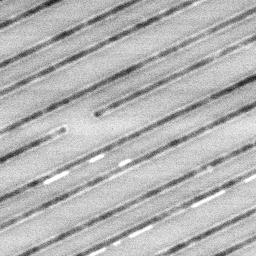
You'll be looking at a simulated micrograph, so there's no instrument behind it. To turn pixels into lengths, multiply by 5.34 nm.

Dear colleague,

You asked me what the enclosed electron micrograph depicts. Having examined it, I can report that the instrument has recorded parallel lines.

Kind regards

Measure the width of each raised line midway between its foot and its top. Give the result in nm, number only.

42.2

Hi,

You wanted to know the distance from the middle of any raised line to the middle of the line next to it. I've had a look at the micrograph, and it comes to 30 pixels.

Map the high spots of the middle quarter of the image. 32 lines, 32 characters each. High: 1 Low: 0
10000000000000001111100000000001
00000000000000111110000000000111
00000000000011111000000000011110
00000000001111100000000001111000
00000000111110000000000111100000
00000011111000000000011110000000
00001111100000000011111000000000
00111110000000001111100000000000
11111000000000111110000000000000
11000000000011110000000000000000
00000000001111000000000000000001
00000000111100000000000000000111
00000001110000000000000000011110
00000000000000000000000011111000
00000000000000000000001111100000
00000000000000000000111110000000
10000000000000000011111000000000
00000000000000001111000000000011
00000000000000111100000000001111
00000000000011110000000000111110
00000000001111000000000011111000
00000000111100000000001111100000
00000111110000000000111110000000
00001111000000000011111000000000
00111100000000001111000000000000
11110000000000111100000000000000
11000000000011110000000000000000
00000000011111000000000000000011
00000001111100000000000000001111
00000111110000000000000000111100
00011111000000000000000011110000
01111100000000000000001111000000